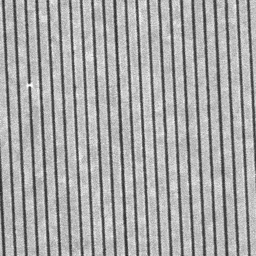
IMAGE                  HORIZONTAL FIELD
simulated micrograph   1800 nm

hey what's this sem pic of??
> parallel lines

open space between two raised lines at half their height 0.0237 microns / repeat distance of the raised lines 78.2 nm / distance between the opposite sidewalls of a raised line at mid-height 0.0526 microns